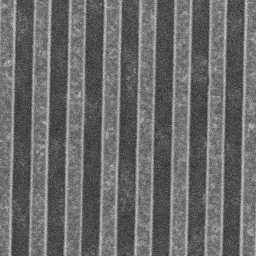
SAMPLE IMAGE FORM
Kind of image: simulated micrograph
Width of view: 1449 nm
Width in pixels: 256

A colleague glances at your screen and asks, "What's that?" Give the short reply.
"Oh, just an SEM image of parallel lines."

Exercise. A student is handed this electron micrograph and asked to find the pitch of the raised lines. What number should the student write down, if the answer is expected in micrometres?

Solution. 0.199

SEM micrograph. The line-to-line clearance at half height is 109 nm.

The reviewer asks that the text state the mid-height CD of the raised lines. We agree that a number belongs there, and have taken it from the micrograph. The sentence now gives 89.1 nanometres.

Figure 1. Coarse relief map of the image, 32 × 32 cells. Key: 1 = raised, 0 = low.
11001100011001100010001100110001
11001100011001100010001100110001
11001100011001100010001100110001
11001100011001100110001100110001
11001100011001100110001100110001
11001100011001100110001100110001
11001100011001100110001100110001
11001100011001100110001100110001
11001100011001100110001100110001
11001100010001100110001100110001
11001100010001100110001100110001
11001100010001100110001100110001
11001100010001100110001100110001
11001100110001100110001100110001
11001100110001100110001100110011
11001100010001100110001100110011
11001100110001100110001100110011
10001100110001100110001100110011
10001100110001100110001100110011
10001100110001100110001100110011
10001100110001100110001000110011
10001100110001100110011000110011
10001100110001100110011000110011
10001100110001100110011000110011
10001100110001100110011000110011
10001100110001100110011000110011
10001100110001100110011000110011
10001100110001000110011000110011
10001100110001000110011000110011
10001100110001000110011000110011
10001100110001000110011000110011
10001100110001000110011000110011